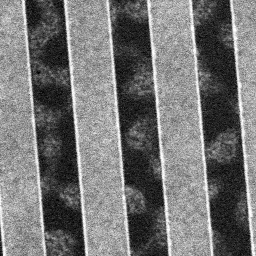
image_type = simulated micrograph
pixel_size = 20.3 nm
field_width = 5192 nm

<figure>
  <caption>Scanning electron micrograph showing one or a few lines or trenches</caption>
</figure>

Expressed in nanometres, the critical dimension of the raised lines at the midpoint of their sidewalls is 851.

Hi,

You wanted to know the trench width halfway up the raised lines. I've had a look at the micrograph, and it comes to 816 nm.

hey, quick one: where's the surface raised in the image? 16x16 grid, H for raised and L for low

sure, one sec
HHLLHHHLLHHHLLHH
HHLLHHHLLHHHLLLH
HHLLHHHLLHHHLLLH
HHLLHHHLLLHHLLLH
HHLLHHHLLLHHLLLH
HHLLLHHLLLHHHLLH
HHLLLHHLLLHHLLLH
HHLLLHHLLLHHHLLH
HHLLLHHLLLHHHLLH
HHLLLHHHLLHHHLLH
HHLLLHHHLLHHHLLH
HHLLLHHHLLHHHLLH
HHHLLHHHLLHHHLLL
HHHLLHHHLLHHHLLL
HHHLLHHHLLHHHLLL
HHHLLHHHLLLHHLLL